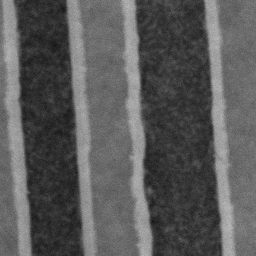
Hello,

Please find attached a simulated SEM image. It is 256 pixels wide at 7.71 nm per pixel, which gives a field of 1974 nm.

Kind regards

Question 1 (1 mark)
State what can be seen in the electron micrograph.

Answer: one or a few lines or trenches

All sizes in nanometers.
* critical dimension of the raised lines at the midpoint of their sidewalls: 441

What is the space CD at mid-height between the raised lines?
71.2 px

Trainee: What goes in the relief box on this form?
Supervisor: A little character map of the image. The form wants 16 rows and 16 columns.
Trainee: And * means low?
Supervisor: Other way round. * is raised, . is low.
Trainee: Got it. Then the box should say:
*...****.....***
*....***.....***
*....***.....***
*....***.....***
*....***.....***
*....***......**
*....***......**
*....****.....**
*....****.....**
*....****.....**
*....****.....**
*....****.....**
*....****.....**
**...****.....**
**...****.....**
**...****.....**